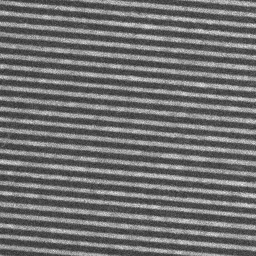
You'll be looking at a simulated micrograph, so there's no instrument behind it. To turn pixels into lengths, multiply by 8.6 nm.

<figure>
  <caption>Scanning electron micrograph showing parallel lines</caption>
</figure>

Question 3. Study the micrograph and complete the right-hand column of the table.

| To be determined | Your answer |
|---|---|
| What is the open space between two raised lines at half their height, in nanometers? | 62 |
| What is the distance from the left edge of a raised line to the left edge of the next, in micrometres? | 0.0909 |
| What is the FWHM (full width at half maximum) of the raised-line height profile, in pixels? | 2.73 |